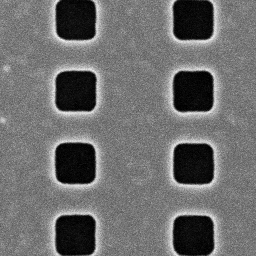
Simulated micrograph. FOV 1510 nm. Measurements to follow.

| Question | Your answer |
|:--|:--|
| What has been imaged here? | holes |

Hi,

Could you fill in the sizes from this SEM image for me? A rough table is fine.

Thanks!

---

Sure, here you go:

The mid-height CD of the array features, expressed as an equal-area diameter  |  267 nm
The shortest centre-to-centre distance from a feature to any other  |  427 nanometres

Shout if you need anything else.